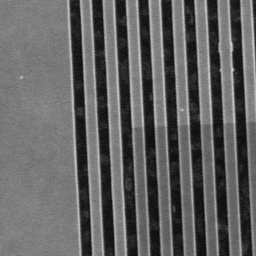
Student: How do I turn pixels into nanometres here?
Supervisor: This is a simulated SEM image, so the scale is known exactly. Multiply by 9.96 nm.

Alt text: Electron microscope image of parallel lines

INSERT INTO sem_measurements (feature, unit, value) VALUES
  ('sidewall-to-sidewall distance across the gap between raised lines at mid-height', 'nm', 118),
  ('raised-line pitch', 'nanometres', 228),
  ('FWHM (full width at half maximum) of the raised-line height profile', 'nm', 110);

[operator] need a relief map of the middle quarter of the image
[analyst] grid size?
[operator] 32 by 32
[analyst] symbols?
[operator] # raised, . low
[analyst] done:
##...###...##...###...###...##..
##...###...##....##...###...##..
##...###...##....##...###...###.
##...###...##....##...###...###.
##...###...##....##...###...###.
##...###...###...##...###...###.
##...###...###...##...###...###.
##...###...###...##....##...###.
##...###...###...##....##...###.
##...###...###...##....##...###.
##...###...###...##....##...###.
##...###...###...###...##...###.
##...###...###...###...##...###.
##...###...###...###...##....##.
###...##...###...###...##....##.
###...##...###...###...##....##.
###...##...###...###...##....##.
###...##...###...###...###...##.
###...##...###...###...###...##.
###...##...###...###...###...##.
###...###...##...###...###...##.
###...###...##...###...###...##.
###...###...##....##...###...##.
###...###...##....##...###...###
###...###...##....##...###...###
###...###...##....##...###...###
###...###...###...##...###...###
###...###...###...##...###...###
###...###...###...##....##...###
###...###...###...##....##...###
###...###...###...##....##...###
###...###...###...##....##...###